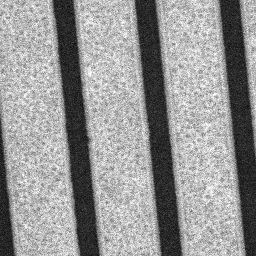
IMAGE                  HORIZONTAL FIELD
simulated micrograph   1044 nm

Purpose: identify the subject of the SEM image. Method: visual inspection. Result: one or a few lines or trenches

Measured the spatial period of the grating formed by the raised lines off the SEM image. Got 82.9 pixels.